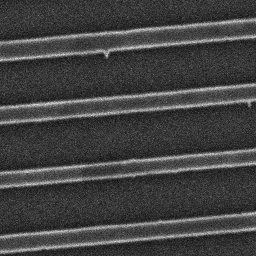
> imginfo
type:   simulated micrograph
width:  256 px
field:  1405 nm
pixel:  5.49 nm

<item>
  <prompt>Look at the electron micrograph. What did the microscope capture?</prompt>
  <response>one or a few lines or trenches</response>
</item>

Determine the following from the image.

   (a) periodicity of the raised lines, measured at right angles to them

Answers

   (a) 352 nanometres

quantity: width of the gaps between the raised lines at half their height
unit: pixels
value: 48.8